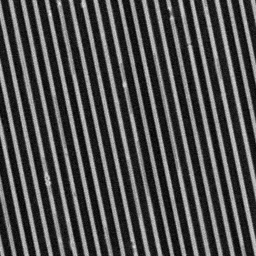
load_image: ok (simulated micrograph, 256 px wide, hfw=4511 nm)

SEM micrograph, parallel lines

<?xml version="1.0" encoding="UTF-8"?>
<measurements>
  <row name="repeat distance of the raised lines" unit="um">0.209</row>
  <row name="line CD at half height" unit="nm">51.8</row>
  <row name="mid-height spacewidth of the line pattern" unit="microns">0.149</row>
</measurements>